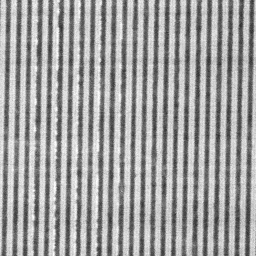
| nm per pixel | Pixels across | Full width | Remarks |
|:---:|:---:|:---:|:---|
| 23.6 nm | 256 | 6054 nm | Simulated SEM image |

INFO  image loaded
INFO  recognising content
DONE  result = parallel lines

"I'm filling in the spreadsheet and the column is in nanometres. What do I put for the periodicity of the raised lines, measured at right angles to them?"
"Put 250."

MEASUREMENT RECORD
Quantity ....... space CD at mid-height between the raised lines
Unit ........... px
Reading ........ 6.75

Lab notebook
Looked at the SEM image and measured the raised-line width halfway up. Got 79.8 nm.